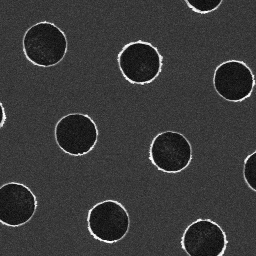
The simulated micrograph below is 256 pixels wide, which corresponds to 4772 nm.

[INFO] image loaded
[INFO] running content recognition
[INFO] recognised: holes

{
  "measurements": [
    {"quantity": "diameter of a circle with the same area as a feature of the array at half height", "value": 735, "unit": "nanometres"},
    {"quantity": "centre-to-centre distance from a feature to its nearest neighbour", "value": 1750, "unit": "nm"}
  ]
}